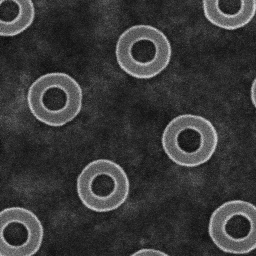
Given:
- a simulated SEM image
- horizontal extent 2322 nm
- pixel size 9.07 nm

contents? ring-shaped raised bodies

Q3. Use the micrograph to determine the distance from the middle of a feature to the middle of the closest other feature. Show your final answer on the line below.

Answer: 892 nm